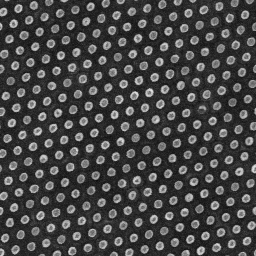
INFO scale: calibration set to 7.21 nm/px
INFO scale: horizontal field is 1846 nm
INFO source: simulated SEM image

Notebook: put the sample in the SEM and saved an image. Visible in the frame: a regular array of raised bodies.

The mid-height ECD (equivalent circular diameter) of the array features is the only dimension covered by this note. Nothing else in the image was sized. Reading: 0.0603 microns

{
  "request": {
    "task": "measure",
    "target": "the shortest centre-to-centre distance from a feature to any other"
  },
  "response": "111 nm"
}